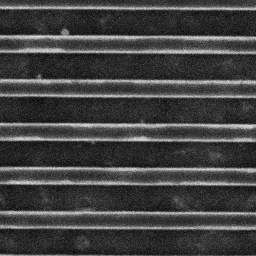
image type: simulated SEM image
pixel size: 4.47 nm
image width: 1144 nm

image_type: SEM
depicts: parallel lines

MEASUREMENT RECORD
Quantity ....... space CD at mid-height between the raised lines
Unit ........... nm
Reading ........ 126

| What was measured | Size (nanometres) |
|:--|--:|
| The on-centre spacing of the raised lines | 196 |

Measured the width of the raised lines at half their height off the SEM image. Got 0.0698 micrometres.